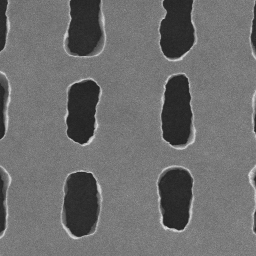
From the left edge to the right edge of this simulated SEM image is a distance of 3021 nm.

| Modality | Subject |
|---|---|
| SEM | holes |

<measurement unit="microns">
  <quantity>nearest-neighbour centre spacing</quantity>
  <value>1.06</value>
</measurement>